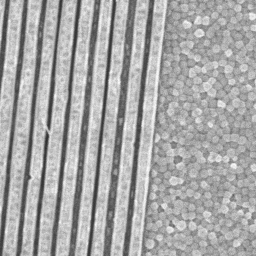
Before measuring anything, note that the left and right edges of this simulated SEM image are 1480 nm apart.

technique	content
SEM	parallel lines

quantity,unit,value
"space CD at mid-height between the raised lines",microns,0.0345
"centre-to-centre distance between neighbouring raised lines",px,17.8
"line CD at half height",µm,0.0643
